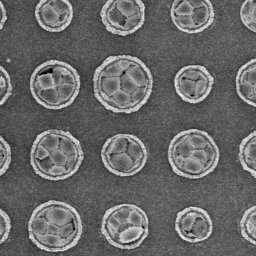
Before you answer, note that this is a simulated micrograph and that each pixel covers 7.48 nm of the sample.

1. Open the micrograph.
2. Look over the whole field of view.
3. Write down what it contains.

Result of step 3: a regular array of raised bodies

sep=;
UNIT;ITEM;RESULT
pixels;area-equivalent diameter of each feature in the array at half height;45.6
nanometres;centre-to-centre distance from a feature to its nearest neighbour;508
